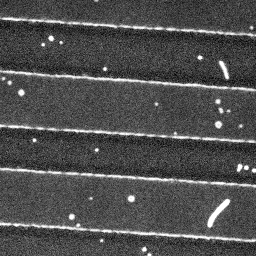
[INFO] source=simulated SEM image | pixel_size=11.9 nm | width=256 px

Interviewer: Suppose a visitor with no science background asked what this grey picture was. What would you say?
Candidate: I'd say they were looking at lines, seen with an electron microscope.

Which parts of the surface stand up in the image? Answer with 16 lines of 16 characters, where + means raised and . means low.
++++++++++++++++
.....+++++++++++
................
................
+...............
+++++++++++++++.
++++++++++++++++
++++++++++++++++
..........++++++
................
................
++++++++++++++..
++++++++++++++++
++++++++++++++++
.......+++++++++
................